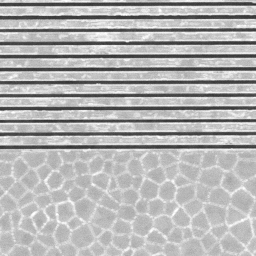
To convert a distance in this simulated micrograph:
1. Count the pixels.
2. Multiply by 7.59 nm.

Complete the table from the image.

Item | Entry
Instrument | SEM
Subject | parallel lines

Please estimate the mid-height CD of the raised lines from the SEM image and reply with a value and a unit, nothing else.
67.4 nm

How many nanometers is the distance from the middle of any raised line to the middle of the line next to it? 98.2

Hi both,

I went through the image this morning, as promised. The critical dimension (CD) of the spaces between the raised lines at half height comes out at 30.4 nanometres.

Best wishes